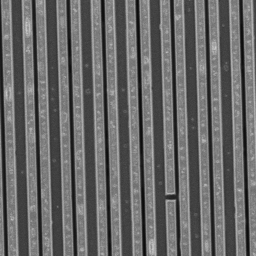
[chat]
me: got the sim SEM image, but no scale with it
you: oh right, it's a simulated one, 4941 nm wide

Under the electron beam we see parallel lines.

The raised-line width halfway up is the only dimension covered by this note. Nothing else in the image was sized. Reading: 193 nanometers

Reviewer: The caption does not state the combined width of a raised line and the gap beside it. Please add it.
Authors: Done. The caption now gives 0.336 µm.